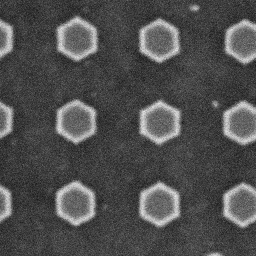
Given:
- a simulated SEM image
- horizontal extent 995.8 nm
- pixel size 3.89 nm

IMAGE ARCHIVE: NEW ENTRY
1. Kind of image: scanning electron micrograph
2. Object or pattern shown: raised bodies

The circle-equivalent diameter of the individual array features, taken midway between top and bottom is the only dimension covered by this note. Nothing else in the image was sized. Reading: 152 nm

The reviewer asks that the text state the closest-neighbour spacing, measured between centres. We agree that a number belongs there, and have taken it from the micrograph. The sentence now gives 319 nm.